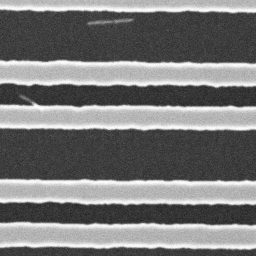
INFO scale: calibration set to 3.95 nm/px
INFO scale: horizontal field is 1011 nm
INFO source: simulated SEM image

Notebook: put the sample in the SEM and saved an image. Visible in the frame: lines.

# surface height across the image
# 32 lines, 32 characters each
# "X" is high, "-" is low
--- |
XXXXXXXXXXXXXXXXXXXXXXXXXXXXXXXX
-----------------------------XXX
--------------------------------
--------------------------------
--------------------------------
--------------------------------
--------------------------------
--------------------------------
XXXXXXXXXXXXXXXXXXXXXXXXXXXXXXXX
XXXXXXXXXXXXXXXXXXXXXXXXXXXXXXXX
--XXXXXX-XXXXXXXXXXXXXXXXXXXXXXX
--------------------------------
--------------------------------
XXXXXXXXXXXXXXXXXXXXXXXXXXXXXXXX
XXXXXXXXXXXXXXXXXXXXXXXXXXXXXXXX
XXXXXXXXXXXXXXXXXXXXXXXXXXXXXXXX
--------------------------------
--------------------------------
--------------------------------
--------------------------------
--------------------------------
--------------------------------
--------------------------------
XXXXXXXXXXXXXXXXXXXXXXXXXXXXXXXX
XXXXXXXXXXXXXXXXXXXXXXXXXXXXXXXX
----------XXX--X-----XXXX-X-XXXX
--------------------------------
--------------------------------
XXXXXXXXXXXXXXXXXXXXXXXXXXXXXXXX
XXXXXXXXXXXXXXXXXXXXXXXXXXXXXXXX
XXXXXXXXXXXXXXXXXXXXXXXXXXXXXXXX
--------------------------------